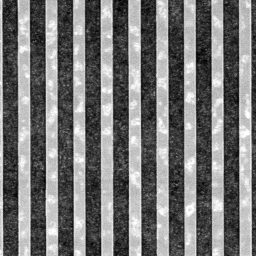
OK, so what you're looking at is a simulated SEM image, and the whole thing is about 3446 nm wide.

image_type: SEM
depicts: parallel lines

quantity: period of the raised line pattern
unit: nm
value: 372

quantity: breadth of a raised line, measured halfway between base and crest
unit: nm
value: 155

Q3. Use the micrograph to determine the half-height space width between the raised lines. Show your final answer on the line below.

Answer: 215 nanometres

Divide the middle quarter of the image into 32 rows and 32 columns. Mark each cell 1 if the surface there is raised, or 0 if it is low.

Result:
00111000011100001110000111000011
00111000011100001110000111000011
00111000011100001110000111000011
00111000011100001110000111000011
00111000011100001110000111000011
00111000011100001110000111000011
00111000011100001110000111000011
00111000011100001110000111000011
00111000011100001110000111000011
00011000011100001110000111000011
00011000011100001110000111000011
00011000011100001110000111000011
00011000011100001110000111000011
00011000011100001110000111000011
00011000011100001110000111000011
00011000011100001110000111000011
00011000011100001110000111000011
00011000011100001110000111000011
00011000011100001110000111000011
00011000011100001110000111000011
00011000011100001110000111000011
00011000011100001110000111000011
00011000011100001110000111000011
00011000011100001110000111000011
00011000011100001110000111000011
00011000011100001110000111000011
00011000011100001110000111000011
00011000011100001110000111000011
00011000011100001110000111000011
00011000011100000110000111000011
00011000011100000110000111000011
00011000011100000110000111000011